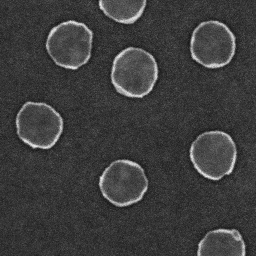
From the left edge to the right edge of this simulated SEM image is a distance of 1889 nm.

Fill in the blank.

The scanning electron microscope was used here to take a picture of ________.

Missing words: raised bodies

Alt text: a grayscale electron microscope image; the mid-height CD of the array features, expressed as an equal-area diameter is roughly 340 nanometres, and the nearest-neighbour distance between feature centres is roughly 625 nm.